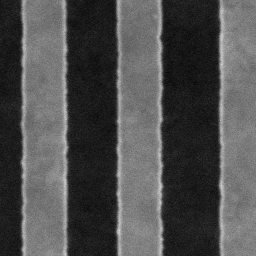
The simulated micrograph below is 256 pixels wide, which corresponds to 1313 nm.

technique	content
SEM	lines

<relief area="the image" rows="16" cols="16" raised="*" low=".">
.***...***....**
.***...***....**
.***...***....**
.***...***....**
.***...***....**
.***...***....**
.***...***....**
.***...***....**
.***...***....**
.***...***....**
.***...***....**
.***...***....**
.***...***....**
.***...***....**
.***...***....**
.***...***....**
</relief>